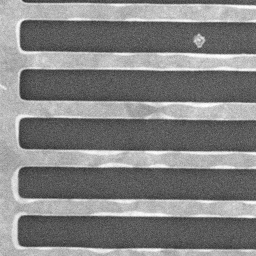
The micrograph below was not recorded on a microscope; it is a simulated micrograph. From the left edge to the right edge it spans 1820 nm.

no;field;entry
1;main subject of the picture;groups of lines, slits or small figures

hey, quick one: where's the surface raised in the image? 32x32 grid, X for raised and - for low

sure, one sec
XXXXX--XXXXX--------------------
XXXXXXXXXXXXXXXXXXXXXXXXXXXXXXXX
XXX--------XXXXX-XXXXXXXXXXXXXXX
XX------------------------------
XX------------------------------
XX------------------------------
XXX--XX-------------------------
XXXXXXXXXXXXXXXXXXXXXXXXXXXXXXXX
XXXX-XXXXXXXXXXXXXXXXXXXXXXXXXXX
XX------------------------------
XX------------------------------
XX------------------------------
XXX-----------------------------
XXXXXXXXXXXXXXXXXXXXXXXXXXXXXXXX
XXXXXXXXXXXXXXXXXXXXXXXXXXXXXXXX
XX------------------------------
XX------------------------------
XX------------------------------
XXX-----------------------------
XXXXXXXXXXXXXXXXXXXXXXXXXXXXXXXX
XXXXXXXXXXXXXXXXXXXXXXXXXXXXXXXX
XX------------------------------
XX------------------------------
XX------------------------------
XX------------------------------
XXXXXXXXXXXXXXXXXXXXXXXXXXXXXXXX
XXXXXXXXXXXXXXXXXXXXXXXXXXXXXXXX
XX------------------------------
XX------------------------------
XX------------------------------
XX------------------------------
XXXXXXXXXXXXXXXXXXXXXXXXXXXXXXXX